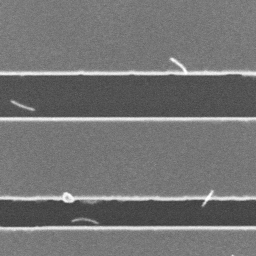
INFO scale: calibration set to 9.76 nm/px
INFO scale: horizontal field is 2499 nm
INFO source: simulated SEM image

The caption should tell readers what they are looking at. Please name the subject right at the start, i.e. lines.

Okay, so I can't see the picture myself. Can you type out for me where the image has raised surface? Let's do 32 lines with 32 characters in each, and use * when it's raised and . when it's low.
********************************
********************************
********************************
********************************
********************************
********************************
********************************
********************************
********************************
................................
................................
................................
................................
................................
................................
********************************
********************************
********************************
********************************
********************************
********************************
********************************
********************************
********************************
********************************
................................
................................
................................
********************************
********************************
********************************
********************************